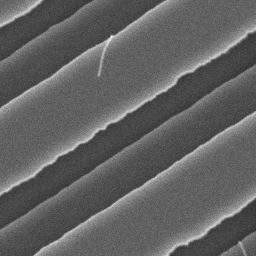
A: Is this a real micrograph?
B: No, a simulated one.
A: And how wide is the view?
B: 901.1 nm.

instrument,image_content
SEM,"lines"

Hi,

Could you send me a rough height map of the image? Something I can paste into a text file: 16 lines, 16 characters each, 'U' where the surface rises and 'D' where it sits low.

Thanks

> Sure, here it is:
UUDDDDDDDDUUUUUU
DDDDDDDDUUUUUUUU
DDDDDDDUUUUUUUUD
DDDDDUUUUUUUUUDD
DDDDUUUUUUUUDDDD
DDUUUUUUUUUDDDDD
UUUUUUUUUDDDDDDD
UUUUUUUDDDDDDDDU
UUUUUUDDDDDDDUUU
UUUUDDDDDDDDUUUU
UUUDDDDDDDDUUUUU
UDDDDDDDDUUUUUUU
DDDDDDDUUUUUUUUU
DDDDDDUUUUUUUUDD
DDDDUUUUUUUUUDDD
DDDUUUUUUUUDDDDD